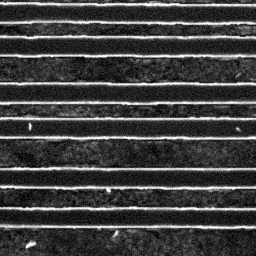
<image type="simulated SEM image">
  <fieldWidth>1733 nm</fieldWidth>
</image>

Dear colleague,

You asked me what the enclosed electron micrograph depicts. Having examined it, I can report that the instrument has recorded lines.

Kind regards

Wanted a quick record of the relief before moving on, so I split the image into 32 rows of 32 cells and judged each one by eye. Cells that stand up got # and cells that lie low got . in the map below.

###########################.....
################################
################################
..............................#.
#.......#.#.................#.##
################################
################################
................................
................................
................................
##############...########....###
################################
################################
................................
........##......................
################################
################################
...#............................
................................
................................
................................
################################
################################
.......###...###.##.#######.##..
................................
................................
################################
################################
................#...............
................................
................................
................................